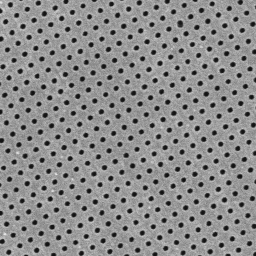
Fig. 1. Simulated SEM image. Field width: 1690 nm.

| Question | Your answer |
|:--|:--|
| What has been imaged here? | a regular array of holes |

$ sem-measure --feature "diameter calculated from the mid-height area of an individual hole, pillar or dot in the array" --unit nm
34.1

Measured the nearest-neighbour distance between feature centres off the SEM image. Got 12.2 pixels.